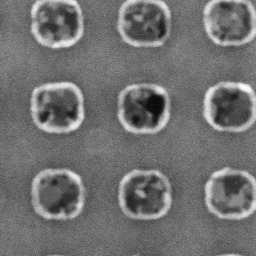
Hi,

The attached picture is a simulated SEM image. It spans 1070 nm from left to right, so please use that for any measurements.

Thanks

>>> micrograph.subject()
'raised bodies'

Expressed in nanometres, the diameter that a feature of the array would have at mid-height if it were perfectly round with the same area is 203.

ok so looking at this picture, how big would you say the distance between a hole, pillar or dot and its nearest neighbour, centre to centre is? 359 nanometres